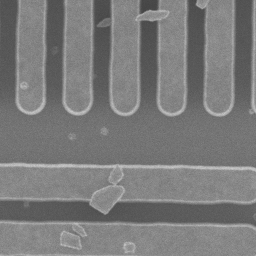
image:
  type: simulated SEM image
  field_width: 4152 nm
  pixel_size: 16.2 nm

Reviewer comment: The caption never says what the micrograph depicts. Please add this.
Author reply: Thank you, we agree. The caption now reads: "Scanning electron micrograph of groups of lines, slits or small figures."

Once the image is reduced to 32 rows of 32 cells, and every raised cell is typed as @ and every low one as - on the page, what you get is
--@@@@--@@@@--@@@---@@@--@@@@---
--@@@@--@@@@--@@@@@@@@@---@@@---
--@@@@--@@@@-@@@@@@@@@@---@@@---
--@@@@--@@@@--@@@---@@@---@@@---
--@@@@--@@@@--@@@---@@@---@@@---
--@@@@--@@@@--@@@---@@@---@@@---
--@@@@--@@@@--@@@---@@@---@@@---
--@@@@--@@@---@@@---@@@---@@@---
--@@@@--@@@---@@@---@@@---@@@---
--@@@@--@@@---@@@---@@@---@@@---
--@@@@--@@@---@@@---@@@---@@@---
--@@@@--@@@---@@@---@@@---@@@---
--@@@@--@@@---@@@---@@@---@@@---
--@@@---@@@---@@@---@@@---@@@---
--------------------------------
--------------------------------
--------------------------------
--------------------------------
--------------------------------
--------------------------------
--------------------------------
@@@@@@@@@@@@@@@@@@@@@@@@@@@@@@@@
@@@@@@@@@@@@@@@@@@@@@@@@@@@@@@@@
@@@@@@@@@@@@@@@@@@@@@@@@@@@@@@@@
@@@@@@@@@@@@@@@@@@@@@@@@@@@@@@@@
-----------@@@------------------
--------------------------------
--------------------------------
@@@@@@@@@@@@@@@@@@@@@@@@@@@@@@@@
@@@@@@@@@@@@@@@@@@@@@@@@@@@@@@@@
@@@@@@@@@@@@@@@@@@@@@@@@@@@@@@@@
@@@@@@@@@@@@@@@@@@@@@@@@@@@@@@@@